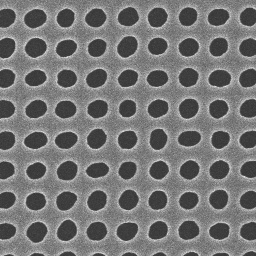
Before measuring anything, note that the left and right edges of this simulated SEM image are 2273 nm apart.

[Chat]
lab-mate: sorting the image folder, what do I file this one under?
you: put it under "a regular array of holes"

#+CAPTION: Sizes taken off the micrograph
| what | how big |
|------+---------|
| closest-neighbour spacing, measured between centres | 29.9 pixels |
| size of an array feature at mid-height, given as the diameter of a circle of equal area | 0.171 µm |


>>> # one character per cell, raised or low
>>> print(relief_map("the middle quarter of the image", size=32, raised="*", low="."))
********************************
.*******..*****..******.******..
...***.....***....***.....***...
...**......**......**.....***...
...***....****....***.....***...
..****...*****...*****..******..
********************************
********************************
********************************
..*****...*****...****....***...
...***.....***....***.....***...
...***.....***....***.....***...
...***.....***....***....****...
.******..*********************.*
********************************
********************************
*******...************...*******
...***....****....****....***...
...***.....***....****....***...
...***....****....***.....***...
..****....****....****...*****..
********************************
********************************
********************************
..*************..******..*****..
...***.....***....****....***...
...***.....***....***.....***...
...***.....***....****....***...
..*************..*****...*****..
********************************
********************************
********************************